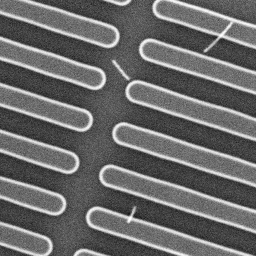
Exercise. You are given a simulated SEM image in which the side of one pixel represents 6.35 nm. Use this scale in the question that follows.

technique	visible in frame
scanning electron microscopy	groups of lines, slits or small figures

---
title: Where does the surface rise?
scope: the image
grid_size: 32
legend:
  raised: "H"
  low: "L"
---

HHHHHLLLLLLLLLLLLLLHHHHLLLLLLLLL
HHHHHHHHLLLLLLLLLLLHHHHHHHLLLLLL
LLLHHHHHHHHLLLLLLLLLLHHHHHHHHLLL
LLLLLLHHHHHHHHLLLLLLLLLLHHHHHHHH
LLLLLLLLLHHHHHHLLLLLLLLLLLLHHHHH
HHLLLLLLLLLLHHLLLLHHHLLLLLLLLLHH
HHHHHHLLLLLLLLLLLLHHHHHHLLLLLLLL
HHHHHHHHHLLLLLLLLLHHHHHHHHHLLLLL
LLLLHHHHHHHHLLLLLLLLLLHHHHHHHHLL
LLLLLLLHHHHHHLLLLLLLLLLLLHHHHHHH
LLLLLLLLLLHHHLLLHHLLLLLLLLLLHHHH
HHHLLLLLLLLLLLLLHHHHHLLLLLLLLLLH
HHHHHHLLLLLLLLLLHHHHHHHHHLLLLLLL
LHHHHHHHHLLLLLLLLLLHHHHHHHHHLLLL
LLLLHHHHHHHLLLLLLLLLLLHHHHHHHHHL
LLLLLLLHHHHLLLLHLLLLLLLLLLHHHHHH
HLLLLLLLLLLLLLHHHHHLLLLLLLLLLHHH
HHHHLLLLLLLLLLHHHHHHHHLLLLLLLLLL
HHHHHHHLLLLLLLLLLHHHHHHHHLLLLLLL
LLHHHHHHHLLLLLLLLLLLHHHHHHHHHLLL
LLLLLHHHHHLLLLLLLLLLLLLHHHHHHHHL
LLLLLLLLHLLLLHHHLLLLLLLLLLHHHHHH
HLLLLLLLLLLLLHHHHHHHLLLLLLLLLLHH
HHHHHLLLLLLLLLHHHHHHHHHLLLLLLLLL
HHHHHHHLLLLLLLLLLLHHHHHHHHLLLLLL
LLLHHHHHLLLLLLLLLLLLLHHHHHHHHLLL
LLLLLLHHLLLHHHLLLLLLLLLLHHHHHHHH
LLLLLLLLLLLHHHHHHLLLLLLLLLLHHHHH
HHLLLLLLLLLLHHHHHHHHHLLLLLLLLLHH
HHHHHLLLLLLLLLLHHHHHHHHLLLLLLLLL
HHHHHHLLLLLLLLLLLLHHHHHHHHHLLLLL
LLLHHHLLLLHHLLLLLLLLLHHHHHHHHHLL